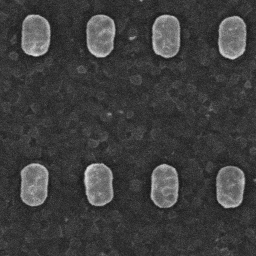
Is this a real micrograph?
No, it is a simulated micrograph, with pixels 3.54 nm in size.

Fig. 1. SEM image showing a regular array of raised bodies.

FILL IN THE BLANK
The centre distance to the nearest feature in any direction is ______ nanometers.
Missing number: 232